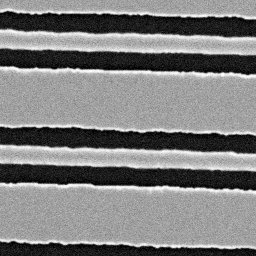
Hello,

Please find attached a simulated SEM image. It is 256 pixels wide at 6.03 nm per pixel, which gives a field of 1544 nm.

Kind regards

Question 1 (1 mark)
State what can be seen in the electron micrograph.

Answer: lines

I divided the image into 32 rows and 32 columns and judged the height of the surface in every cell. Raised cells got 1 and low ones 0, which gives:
11111111111111111111111111111111
00111111111111111111111111111111
00000000000000000000000000000000
00000000000000000000000000000000
11111111111111111111110000000000
11111111111111111111111111111111
00000000000000000011110111111111
00000000000000000000000000000000
11000000000000000000000000000000
11111111111111111111111111111111
11111111111111111111111111111111
11111111111111111111111111111111
11111111111111111111111111111111
11111111111111111111111111111111
11111111111111111111111111111111
11111111111111111111111111111111
00000000000000000000000011111111
00000000000000000000000000000000
11111100000000000000000000000000
11111111111111111111111111111111
00001111111111111111111111111111
00000000000000000000000000000000
00000000000000000000000000000000
11111111111111111111110000000000
11111111111111111111111111111111
11111111111111111111111111111111
11111111111111111111111111111111
11111111111111111111111111111111
11111111111111111111111111111111
11111111111111111111111111111111
00000000100011111111111111111111
00000000000000000000000000000000